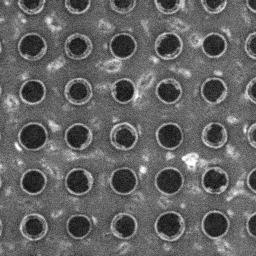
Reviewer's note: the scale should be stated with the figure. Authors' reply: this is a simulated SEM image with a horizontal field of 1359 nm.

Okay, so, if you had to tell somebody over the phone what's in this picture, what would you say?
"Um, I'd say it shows a regular array of raised bodies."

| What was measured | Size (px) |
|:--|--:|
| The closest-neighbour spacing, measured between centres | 44.8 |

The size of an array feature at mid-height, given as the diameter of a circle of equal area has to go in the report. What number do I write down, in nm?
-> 138